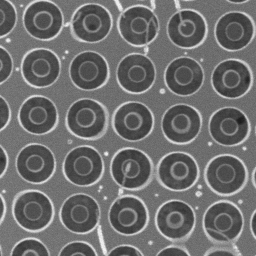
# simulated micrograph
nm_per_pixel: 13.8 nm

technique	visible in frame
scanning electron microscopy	an array of small figures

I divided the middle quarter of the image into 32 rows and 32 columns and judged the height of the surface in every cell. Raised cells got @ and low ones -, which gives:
@@--@@@@---@@@--------@@@@------
@---@@@@---@@----@@@---@@@--@@@@
@@--@@@@---@@---@@@@---@@---@@@@
@@--@@@@---@@---@@@@---@@---@@@@
@@--------@@@@--------@@@---@@@-
@@@------@@@@@--------@@@@------
@@@@@-@@@@@@@@@------@@@@@@-----
@@@@@@@@@@@@@@@@@@@@@@@@@@@@----
@@@@@@@@@@@@@@@@@@@@@@@@@@@@@@@@
@@@-----@@@@@@@@@@@@@@@@@@@@@@@@
@@--------@@@@------@@@@@@@@---@
@---@@@---@@@--------@@@@@------
@--@@@@@---@@---@@----@@@-------
@--@@@@----@---@@@@---@@@---@@@-
@--@@@@----@---@@@@---@@@--@@@@-
@---@@-----@----@@@---@@@--@@@@-
@---------@@@---------@@@---@@@-
@@@------@@@@@-------@@@@-------
@@@@@--@@@@@@@@-----@@@@@@------
@@@@@@@@@@@@@@@@@@@@@@@@@@@----@
@@@@@@@@@@@@@@@@@@@@@@@@@@@@@@@@
@@------@@@@@@----@@@@@@@@@@@@@@
@--------@@@@-------@@@@@@-----@
----@@---@@@---------@@@@-------
---@@@@---@@---@@@----@@--------
---@@@@---@@---@@@@---@----@@@@-
---@@@@---@@---@@@@---@----@@@@-
----@@---@@@---@@@----@----@@@@-
@--------@@@----------@@-----@--
@@------@@@@@--------@@@--------
@@@@@-@@@@@@@@@-----@@@@@-------
@@@@@@@@@@@@@@@@@@@@@@@@@@@--@@@